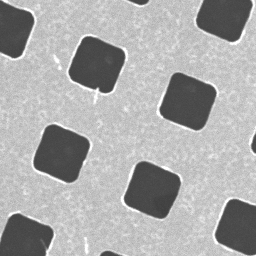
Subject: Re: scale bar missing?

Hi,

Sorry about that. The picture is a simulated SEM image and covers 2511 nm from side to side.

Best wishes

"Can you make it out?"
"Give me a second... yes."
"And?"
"holes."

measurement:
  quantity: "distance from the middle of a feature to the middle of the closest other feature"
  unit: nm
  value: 938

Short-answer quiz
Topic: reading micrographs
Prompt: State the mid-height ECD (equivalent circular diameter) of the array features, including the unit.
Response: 532 nm